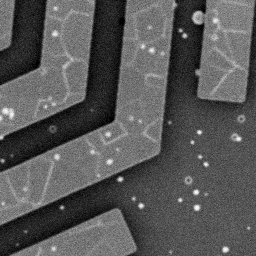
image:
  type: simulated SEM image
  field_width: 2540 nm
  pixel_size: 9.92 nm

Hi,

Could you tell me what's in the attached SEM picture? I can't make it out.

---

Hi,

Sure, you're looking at groups of lines, slits or small figures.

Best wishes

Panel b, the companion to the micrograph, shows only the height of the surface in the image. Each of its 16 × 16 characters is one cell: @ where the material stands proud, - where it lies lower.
@--@@@--@@@--@@@
@--@@@--@@@--@@@
@--@@@--@@@--@@@
---@@@--@@@--@@@
--@@@--@@@---@@-
@@@@@--@@@--@@@-
@@@@@--@@@------
@@-----@@@------
-----@@@@@------
---@@@@@@@------
-@@@@@@@--------
@@@@@@----------
@@@@------------
@-----@@--------
----@@@@--------
--@@@@@@--------